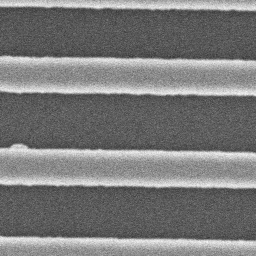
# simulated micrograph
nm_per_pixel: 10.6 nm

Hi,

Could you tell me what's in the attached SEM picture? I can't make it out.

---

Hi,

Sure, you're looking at lines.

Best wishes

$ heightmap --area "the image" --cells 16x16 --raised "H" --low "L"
LLLLLLLHHHHHHHHH
LLLLLLLLLLLLLLLL
LLLLLLLLLLLLLLLL
LLLLLLLLLLLLLLLL
HHHHHHHHHHHHHHHH
HHHHHHHHHHHHHHHH
LLLLLLLLLLLLLLLL
LLLLLLLLLLLLLLLL
LLLLLLLLLLLLLLLL
HHHHHHHHHHHHHLLL
HHHHHHHHHHHHHHHH
LHHHHHHHHHHHHHHH
LLLLLLLLLLLLLLLL
LLLLLLLLLLLLLLLL
LLLLLLLLLLLLLLLL
HHHHHHHHHHHHHHHH